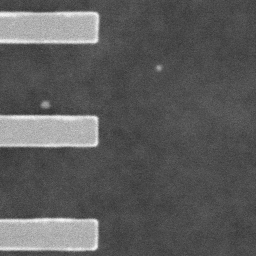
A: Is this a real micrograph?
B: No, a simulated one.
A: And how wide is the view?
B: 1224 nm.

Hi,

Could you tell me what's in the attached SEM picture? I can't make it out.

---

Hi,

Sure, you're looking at wiring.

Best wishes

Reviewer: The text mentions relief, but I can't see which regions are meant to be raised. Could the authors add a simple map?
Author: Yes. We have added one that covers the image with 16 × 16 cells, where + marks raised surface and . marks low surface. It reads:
................
++++++..........
++++++..........
................
................
................
................
++++++..........
++++++..........
................
................
................
................
................
++++++..........
++++++..........